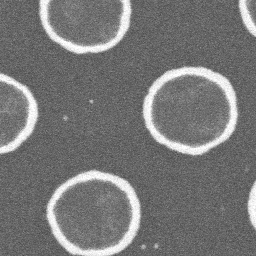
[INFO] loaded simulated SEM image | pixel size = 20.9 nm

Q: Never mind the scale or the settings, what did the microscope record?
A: raised bodies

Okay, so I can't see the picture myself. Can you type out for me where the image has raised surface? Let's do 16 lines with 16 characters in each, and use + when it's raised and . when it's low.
...+++++.......+
...+++++........
....+++.........
................
...........+....
+.........++++..
++.......++++++.
++.......++++++.
+.........++++..
................
................
....++++........
...+++++........
...++++++.......
...+++++........
....+++.........